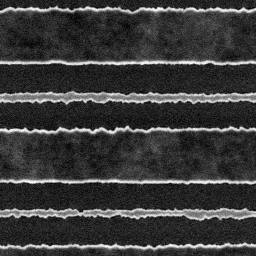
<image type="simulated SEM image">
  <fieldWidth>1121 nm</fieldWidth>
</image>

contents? lines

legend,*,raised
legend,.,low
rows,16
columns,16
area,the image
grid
................
****************
****************
****************
................
................
................
................
****************
****************
****************
................
................
................
................
****************